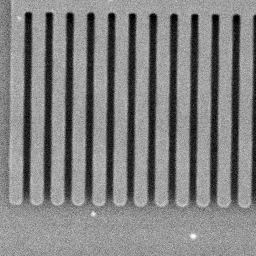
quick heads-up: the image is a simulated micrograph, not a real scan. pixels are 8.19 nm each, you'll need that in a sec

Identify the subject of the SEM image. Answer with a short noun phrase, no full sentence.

groups of lines, slits or small figures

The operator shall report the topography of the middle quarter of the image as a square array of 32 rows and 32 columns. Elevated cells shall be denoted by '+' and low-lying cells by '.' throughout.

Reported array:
..+++...+++..+++..+++..+++..+++.
..+++...+++..+++..+++..+++..+++.
..+++...+++..+++..+++..+++..+++.
..+++...+++..+++..+++..+++..+++.
..+++...+++..+++..+++..+++..+++.
..+++...+++..+++..+++..+++..+++.
..+++...+++..+++..+++..+++..+++.
..+++...+++..+++..+++..+++..+++.
..+++...+++..+++..+++..+++..+++.
..+++...+++..+++..+++..+++..+++.
..+++...+++..+++..+++..+++..+++.
..+++...+++..+++..+++..+++..+++.
..+++...+++..+++..+++..+++..+++.
..+++...++...+++..+++..+++..+++.
..+++...++...+++..+++..+++..+++.
..+++...++...+++..+++..+++..+++.
..+++...++...+++..+++..+++..+++.
..+++..+++...+++..+++..+++..+++.
..+++..+++...+++..+++..+++..+++.
..+++..+++...+++..+++..+++..+++.
..+++..+++...+++..+++..+++..+++.
..+++..+++...+++..+++..+++..+++.
..+++..+++...+++..+++..+++..+++.
..+++..+++...+++..+++..+++..+++.
..+++..+++...+++..+++..+++..+++.
..+++..+++...+++..+++..+++..+++.
..+++..+++...+++..+++..+++..+++.
..+++..+++...+++..+++..+++..+++.
..+++..+++...+++..+++..+++..+++.
..+++..+++...+++..+++..+++..+++.
..+++..+++...+++..+++..+++..+++.
..+++..+++...+++..+++..+++..+++.